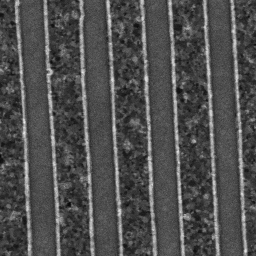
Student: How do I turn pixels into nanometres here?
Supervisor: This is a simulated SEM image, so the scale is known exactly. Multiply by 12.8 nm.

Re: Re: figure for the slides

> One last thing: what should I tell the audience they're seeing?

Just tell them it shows one or a few lines or trenches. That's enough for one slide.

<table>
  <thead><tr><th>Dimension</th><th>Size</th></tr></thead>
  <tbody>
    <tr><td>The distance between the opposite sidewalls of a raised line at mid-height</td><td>442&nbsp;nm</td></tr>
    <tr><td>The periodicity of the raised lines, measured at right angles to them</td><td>798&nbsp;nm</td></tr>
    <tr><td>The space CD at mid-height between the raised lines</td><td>0.355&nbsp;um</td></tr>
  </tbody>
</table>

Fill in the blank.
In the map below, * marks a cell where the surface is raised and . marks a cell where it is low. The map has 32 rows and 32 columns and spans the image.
**....****....****...*****...***
**....****....****...*****...***
**....****....****...*****...***
**....****....****...*****...***
**....****....****....****...***
**....****....****....****...***
**....****....****....****...***
**....****....****....****...***
***...****....****....****....**
***...****....****....****....**
***...****....****....****....**
***...****....****....****....**
***...*****...****....****....**
***...*****...****....****....**
***...*****...*****...****....**
***...*****...*****...****....**
***....****...*****...****....**
***....****...*****...****....**
***....****...*****...*****...**
***....****...*****...*****...**
***....****....****...*****...**
***....****....****...*****...**
***....****....****...*****...**
***....****....****...*****...**
***....****....****...*****...**
***....****....****....****...**
****...****....****....****...**
****...****....****....****....*
****...****....****....****....*
****...****....****....****....*
****...****....****....****....*
****...*****...****....****....*